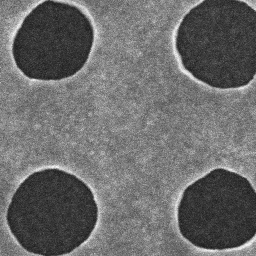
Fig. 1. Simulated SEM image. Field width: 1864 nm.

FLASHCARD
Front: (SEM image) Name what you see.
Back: holes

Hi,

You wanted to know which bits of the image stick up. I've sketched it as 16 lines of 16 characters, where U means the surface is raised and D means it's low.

UUDDDUUUUUUUDDDD
UDDDDDUUUUUDDDDD
UDDDDDUUUUUDDDDD
UDDDDDUUUUUDDDDD
UDDDDUUUUUUUDDDD
UUUUUUUUUUUUUDDU
UUUUUUUUUUUUUUUU
UUUUUUUUUUUUUUUU
UUUUUUUUUUUUUUUU
UUUUUUUUUUUUUUUU
UUUUUUUUUUUUUUUU
UDDDDUUUUUUUDDDD
UDDDDDUUUUUDDDDD
DDDDDDUUUUUDDDDD
UDDDDDUUUUUDDDDD
UDDDDUUUUUUUUDDU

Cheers